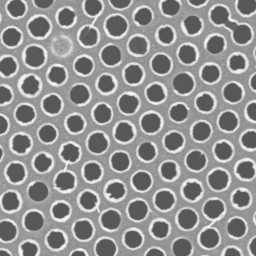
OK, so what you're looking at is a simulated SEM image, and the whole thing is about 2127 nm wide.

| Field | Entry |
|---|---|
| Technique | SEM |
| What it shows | a regular array of holes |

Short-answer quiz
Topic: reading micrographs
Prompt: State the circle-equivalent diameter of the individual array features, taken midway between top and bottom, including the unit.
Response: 148 nanometres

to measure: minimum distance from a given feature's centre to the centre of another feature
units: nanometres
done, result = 238